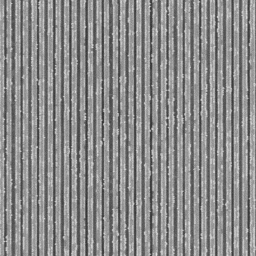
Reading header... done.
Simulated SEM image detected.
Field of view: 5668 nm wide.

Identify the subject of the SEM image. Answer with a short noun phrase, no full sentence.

parallel lines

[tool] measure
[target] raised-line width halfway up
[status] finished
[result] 0.0997 µm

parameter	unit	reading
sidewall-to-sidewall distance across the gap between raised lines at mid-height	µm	0.0803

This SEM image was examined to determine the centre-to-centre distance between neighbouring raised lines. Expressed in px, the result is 8.11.